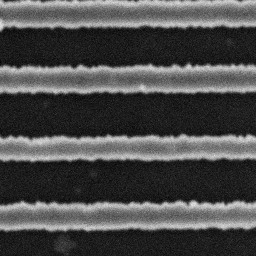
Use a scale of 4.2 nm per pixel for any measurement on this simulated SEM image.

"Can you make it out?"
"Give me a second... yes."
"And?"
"lines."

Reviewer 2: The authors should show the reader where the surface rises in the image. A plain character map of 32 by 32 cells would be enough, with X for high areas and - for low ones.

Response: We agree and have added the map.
XXXXXXXXXXXXXXXXXXXXXXXXXXXXXXXX
XXXXXXXXXXXXXXXXXXXXXXXXXXXXXXXX
XXXXXXXXXXXXXXXXXXXXXXXXXXXXXXXX
X-------------------------------
--------------------------------
--------------------------------
--------------------------------
--------------------------------
XX-XX--XXXXXXX-XXXXXXXXXXXXXXXXX
XXXXXXXXXXXXXXXXXXXXXXXXXXXXXXXX
XXXXXXXXXXXXXXXXXXXXXXXXXXXXXXXX
-X----XXXXX-------X-XX-XX-------
--------------------------------
--------------------------------
--------------------------------
--------------------------------
--------------------------------
XXXXXXXXXXXXXXXXXXXXXXXXXXXXXXXX
XXXXXXXXXXXXXXXXXXXXXXXXXXXXXXXX
XXXXXXXXXXXXXXXXXXXXXXXXXXXXXXXX
--------------------------------
--------------------------------
--------------------------------
--------------------------------
--------------------------------
--X-X-X-----XXX-X-X-X-XXXX-X-XXX
XXXXXXXXXXXXXXXXXXXXXXXXXXXXXXXX
XXXXXXXXXXXXXXXXXXXXXXXXXXXXXXXX
XXXXXXXXXXXXXXXX--XX----X-------
--------------------------------
--------------------------------
--------------------------------